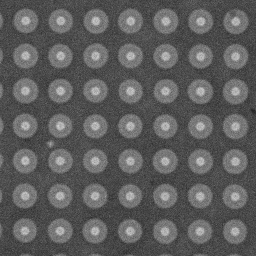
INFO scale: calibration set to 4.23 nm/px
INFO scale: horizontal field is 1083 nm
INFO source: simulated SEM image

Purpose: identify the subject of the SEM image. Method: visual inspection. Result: an array of small figures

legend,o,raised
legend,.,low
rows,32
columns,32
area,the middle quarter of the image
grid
o.....oooo.....ooo......ooo.....
................................
................................
................................
o.....oooo.....oooo.....ooo.....
oo...oooooo...ooooo....ooooo...o
oo...oooooo...ooooo....ooooo...o
oo...oooooo...ooooo....ooooo...o
o....ooooo....ooooo....ooooo....
........o......ooo......ooo.....
................................
................................
................................
o.....oooo....ooooo....oooo.....
oo...oooooo...ooooo....ooooo...o
oo...oooooo...ooooo....ooooo...o
oo...oooooo...ooooo....ooooo...o
o.....oooo....ooooo....ooooo....
................o...............
................................
................................
.......oo......ooo......oo......
oo...ooooo....ooooo....ooooo....
oo...oooooo...oooooo..oooooo...o
oo...oooooo...oooooo..oooooo...o
oo...oooooo...ooooo...oooooo...o
o.....oooo.....oooo....ooooo....
................................
................................
................................
o.....ooo......ooo......ooo.....
oo...ooooo....ooooo....ooooo...o